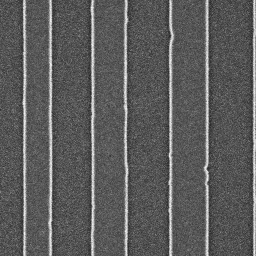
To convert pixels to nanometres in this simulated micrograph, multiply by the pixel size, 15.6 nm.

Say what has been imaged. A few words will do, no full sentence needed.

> one or a few lines or trenches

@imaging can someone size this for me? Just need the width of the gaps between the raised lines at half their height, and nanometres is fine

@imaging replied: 694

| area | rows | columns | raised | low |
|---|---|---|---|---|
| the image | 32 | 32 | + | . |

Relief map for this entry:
...+++......++++.....+++++......
...+++......++++.....+++++......
...+++......++++.....+++++......
...+++......++++.....+++++......
...+++......++++.....+++++......
...+++......++++.....+++++......
...+++......++++.....+++++......
...+++......++++.....+++++......
...+++......++++.....+++++......
...+++......++++.....+++++......
...+++......++++.....+++++......
...+++......++++.....+++++......
...+++......++++.....+++++......
...+++......++++.....+++++......
...+++......++++.....+++++......
...+++......++++.....+++++......
...+++......++++.....+++++......
...+++......++++.....+++++......
...+++......++++.....+++++......
...+++......++++.....+++++......
...+++......++++.....+++++......
...+++......++++.....+++++......
...+++......++++.....+++++......
...+++......++++.....+++++......
...+++......++++.....+++++......
...+++......++++.....+++++......
...+++......++++.....+++++......
...+++......++++.....+++++......
...+++......++++.....+++++......
...+++......++++.....+++++......
...+++......++++.....+++++......
...+++......++++.....+++++......